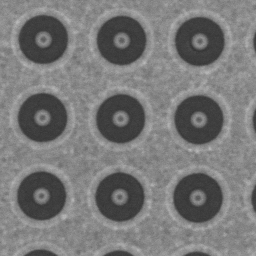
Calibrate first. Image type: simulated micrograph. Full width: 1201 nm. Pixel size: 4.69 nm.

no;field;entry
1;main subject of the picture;an array of small figures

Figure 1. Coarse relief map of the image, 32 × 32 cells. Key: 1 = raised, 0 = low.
11111111111111111111111111111111
11111011111111111111111111111111
11100000111110000011111000011111
11000000011100000011110000001111
11000100011100010001110000001110
11000100011100010001100011001110
11000000011100000011110000001110
11100000111110000011110000001111
11111111111111101111111100111111
11111111111111111111111111111111
11111111111111111111111111111111
11110001111111001111111101111111
11100000111110000011110000011111
11000000011100000011110000001111
11000100011100110001100010001110
11000000011100000001100010001110
11000000111100000011110000001110
11100001111110000111110000011111
11111111111111111111111111111111
11111111111111111111111111111111
11111111111111111111111111111111
11100001111110000111111000111111
11000000111100000011110000011111
11000000111100000011100000001110
11001100011000110011100010001110
11000000011100000011100000001110
11000000111100000011110000001110
11100001111110000111111000011111
11111111111111111111111111111111
11111111111111111111111111111111
11111111111111111111111111111111
11100001111110000111111000111111